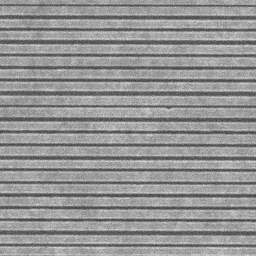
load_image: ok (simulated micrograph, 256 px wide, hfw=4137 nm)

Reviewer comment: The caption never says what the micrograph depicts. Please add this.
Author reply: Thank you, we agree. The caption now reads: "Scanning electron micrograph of parallel lines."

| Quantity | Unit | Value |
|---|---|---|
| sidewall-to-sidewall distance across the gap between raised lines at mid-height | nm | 70.7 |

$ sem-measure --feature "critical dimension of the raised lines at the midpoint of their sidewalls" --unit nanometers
127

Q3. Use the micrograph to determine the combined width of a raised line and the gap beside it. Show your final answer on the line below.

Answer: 205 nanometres